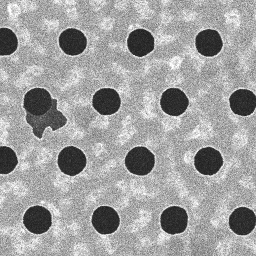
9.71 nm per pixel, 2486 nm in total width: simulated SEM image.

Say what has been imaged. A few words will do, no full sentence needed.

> a regular array of holes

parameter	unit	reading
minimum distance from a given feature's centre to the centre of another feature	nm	659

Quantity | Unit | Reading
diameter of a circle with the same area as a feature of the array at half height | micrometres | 0.277